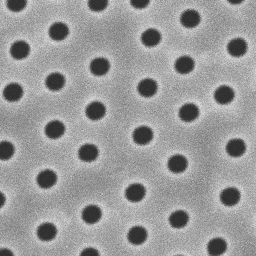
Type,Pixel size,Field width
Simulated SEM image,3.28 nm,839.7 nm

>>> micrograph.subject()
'a regular array of holes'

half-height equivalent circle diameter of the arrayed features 0.0659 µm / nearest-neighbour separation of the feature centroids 43.5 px